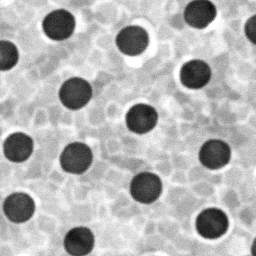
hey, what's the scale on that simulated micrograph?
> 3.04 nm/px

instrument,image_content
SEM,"a regular array of holes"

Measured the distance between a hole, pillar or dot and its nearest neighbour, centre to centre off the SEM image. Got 0.211 um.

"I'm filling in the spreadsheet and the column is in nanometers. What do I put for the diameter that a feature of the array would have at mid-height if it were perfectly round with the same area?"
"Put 102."